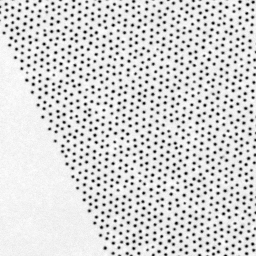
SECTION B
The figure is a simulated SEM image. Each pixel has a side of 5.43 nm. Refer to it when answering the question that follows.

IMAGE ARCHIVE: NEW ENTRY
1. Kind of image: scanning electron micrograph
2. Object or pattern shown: a regular array of holes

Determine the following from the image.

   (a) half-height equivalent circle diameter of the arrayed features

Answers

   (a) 16.2 nm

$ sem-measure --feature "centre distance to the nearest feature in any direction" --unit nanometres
35.9